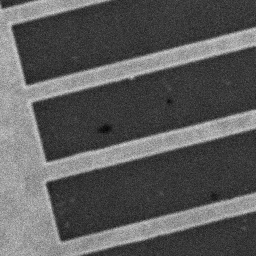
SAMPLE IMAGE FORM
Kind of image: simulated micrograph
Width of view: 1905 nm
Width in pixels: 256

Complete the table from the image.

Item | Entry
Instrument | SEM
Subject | one or a few lines or trenches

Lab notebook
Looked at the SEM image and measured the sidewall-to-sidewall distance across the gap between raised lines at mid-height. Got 479 nm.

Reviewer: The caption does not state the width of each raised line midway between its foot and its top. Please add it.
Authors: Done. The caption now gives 0.118 micrometres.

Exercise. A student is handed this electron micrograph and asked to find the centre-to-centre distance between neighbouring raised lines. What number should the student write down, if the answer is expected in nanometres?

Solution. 596